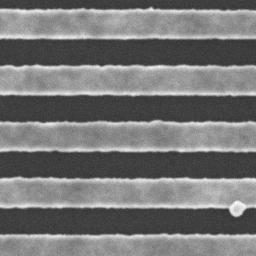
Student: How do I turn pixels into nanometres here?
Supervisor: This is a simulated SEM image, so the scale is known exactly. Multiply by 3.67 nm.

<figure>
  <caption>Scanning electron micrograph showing lines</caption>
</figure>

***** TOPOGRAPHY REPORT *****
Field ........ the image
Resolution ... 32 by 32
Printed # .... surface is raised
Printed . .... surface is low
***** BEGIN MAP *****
................................
################################
################################
################################
################################
................................
................................
................................
################################
################################
################################
################################
................................
................................
................................
################################
################################
################################
################################
................................
................................
................................
################################
################################
################################
################################
.............................#..
................................
................................
################################
################################
################################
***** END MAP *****